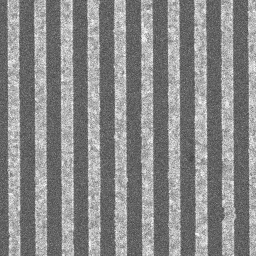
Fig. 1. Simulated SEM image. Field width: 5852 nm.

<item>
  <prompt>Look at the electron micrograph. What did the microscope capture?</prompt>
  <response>parallel lines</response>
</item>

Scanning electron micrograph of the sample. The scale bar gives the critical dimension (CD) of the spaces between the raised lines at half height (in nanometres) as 372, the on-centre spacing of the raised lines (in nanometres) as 611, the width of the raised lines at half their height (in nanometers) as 243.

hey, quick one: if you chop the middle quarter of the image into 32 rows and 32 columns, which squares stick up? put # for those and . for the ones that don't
##....###....##....###....###...
##....###....##....###....###...
##....###....##....###....###...
##....###....##....###....###...
##....###....##.....##....###...
##....###....##.....##....###...
##....###....##.....##....###...
##....###....##.....##....###...
##....###....##.....##....###...
##....###....##.....##....###...
##....###....##.....##....###...
##....###....##.....##....###...
##....###....##.....##....###...
##....###....##.....##....###...
##....###....##.....##....###...
##....###....##.....##....###...
##....###....##.....##....###...
##....###....##....###....###...
##....###....##....###....###...
##....###....##.....##....###...
##....###....##.....##....###...
##....###....###....##....###...
##....###....###...###....###...
##....###....###...###....###...
##....###....###...###....###...
##....###....###....##....###...
##....###....###....##....###...
##....###....###....##....###...
##....###....###....##....###...
##....###....###....##....###...
##....###....###....##....###...
##....###....###....##....###...